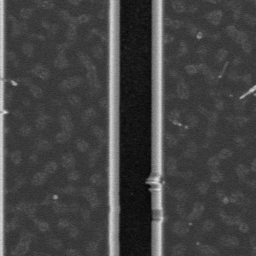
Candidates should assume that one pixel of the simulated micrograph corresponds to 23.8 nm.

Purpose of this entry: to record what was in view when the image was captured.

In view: one or a few lines or trenches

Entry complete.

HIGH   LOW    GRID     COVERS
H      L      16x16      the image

HHHHHHHLLLHHHHHH
HHHHHHHLLLHHHHHH
HHHHHHHLLLHHHHHH
HHHHHHHLLLHHHHHH
HHHHHHHLLLHHHHHH
HHHHHHHLLLHHHHHH
HHHHHHHLLLHHHHHH
HHHHHHHLLLHHHHHH
HHHHHHHLLLHHHHHH
HHHHHHHLLLHHHHHH
HHHHHHHLLLHHHHHH
HHHHHHHLLLHHHHHH
HHHHHHHLLLHHHHHH
HHHHHHHLLLHHHHHH
HHHHHHHLLLHHHHHH
HHHHHHHLLLHHHHHH